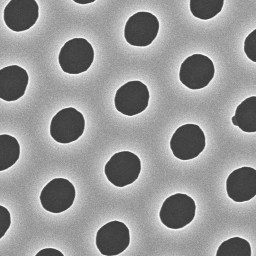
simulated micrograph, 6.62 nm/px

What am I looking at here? a regular array of holes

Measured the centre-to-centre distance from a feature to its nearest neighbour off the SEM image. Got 462 nm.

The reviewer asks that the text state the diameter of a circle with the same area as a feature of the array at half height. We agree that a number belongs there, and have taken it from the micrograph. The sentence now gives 235 nanometres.